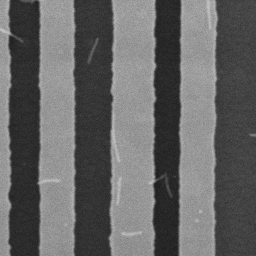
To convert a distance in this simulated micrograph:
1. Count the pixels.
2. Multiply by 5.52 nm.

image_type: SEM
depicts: lines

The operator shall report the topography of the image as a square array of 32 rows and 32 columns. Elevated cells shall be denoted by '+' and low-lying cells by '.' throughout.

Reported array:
+....++++.....+++++....++++.....
+....++++.....+++++....++++.....
+....++++.....+++++....++++.....
+....++++.....+++++....++++.....
+....++++.....+++++....++++.....
+....++++.....+++++....++++.....
+....++++.....+++++....++++.....
+....++++.....+++++....++++.....
+....++++.....+++++....++++.....
+....++++.....+++++....++++.....
+....++++.....+++++....++++.....
+....++++.....+++++....++++.....
+....++++.....+++++....++++.....
+....++++.....+++++....++++.....
+....++++.....+++++....++++.....
+....++++.....+++++....++++.....
+....++++.....+++++...+++++.....
+....++++.....+++++....++++.....
+....++++.....+++++....++++.....
+....++++.....+++++....++++.....
+....++++.....+++++...+++++.....
+....++++.....+++++...+++++.....
+....++++.....+++++...+++++.....
+....++++.....+++++...+++++.....
+....++++.....+++++...+++++.....
+....++++.....+++++...+++++.....
+....++++.....+++++...+++++.....
+....++++.....+++++...+++++.....
+....++++.....+++++...+++++.....
+....++++.....+++++...+++++.....
+....++++.....+++++...+++++.....
+....++++.....+++++...+++++.....